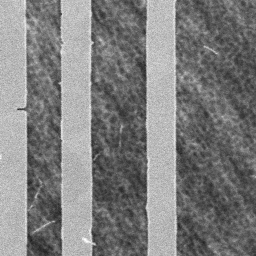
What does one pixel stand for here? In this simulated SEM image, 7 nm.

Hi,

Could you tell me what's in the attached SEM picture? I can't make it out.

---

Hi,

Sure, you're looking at one or a few lines or trenches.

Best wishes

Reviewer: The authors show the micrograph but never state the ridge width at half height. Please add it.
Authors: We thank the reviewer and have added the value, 0.197 um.